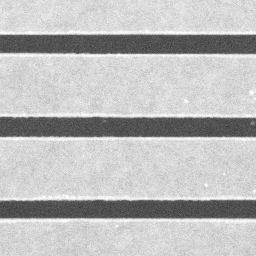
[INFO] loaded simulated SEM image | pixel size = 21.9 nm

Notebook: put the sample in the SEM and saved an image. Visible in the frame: lines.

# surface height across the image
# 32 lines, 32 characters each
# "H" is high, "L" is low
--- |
HHHHHHHHHHHHHHHHHHHHHHHHHHHHHHHH
HHHHHHHHHHHHHHHHHHHHHHHHHHHHHHHH
HHHHHHHHHHHHHHHHHHHHHHHHHHHHHHHH
HHHHHHHHHHHHHHHHHHHHHHHHHHHHHHHH
LLLLLLLLLLLLLLLLLLLLLLLLLLLLLLLL
LLLLLLLLLLLLLLLLLLLLLLLLLLLLLLLL
LLLLLLLLLLLLLLLLLLLLLLLLLLLLLLLL
HHHHHHHHHHHHHHHHHHHHHHHHHHHHHHHH
HHHHHHHHHHHHHHHHHHHHHHHHHHHHHHHH
HHHHHHHHHHHHHHHHHHHHHHHHHHHHHHHH
HHHHHHHHHHHHHHHHHHHHHHHHHHHHHHHH
HHHHHHHHHHHHHHHHHHHHHHHHHHHHHHHH
HHHHHHHHHHHHHHHHHHHHHHHHHHHHHHHH
HHHHHHHHHHHHHHHHHHHHHHHHHHHHHHHH
HHHHHHHHHHHHHHHHHHHHHHHHHHHHHHHH
LLLLLLLLLLLLLLLLLLLLLLLLLLLLLLLL
LLLLLLLLLLLLLLLLLLLLLLLLLLLLLLLL
HHHHHHHHHHHHHHHHHHHHHHHHHHHHHHHH
HHHHHHHHHHHHHHHHHHHHHHHHHHHHHHHH
HHHHHHHHHHHHHHHHHHHHHHHHHHHHHHHH
HHHHHHHHHHHHHHHHHHHHHHHHHHHHHHHH
HHHHHHHHHHHHHHHHHHHHHHHHHHHHHHHH
HHHHHHHHHHHHHHHHHHHHHHHHHHHHHHHH
HHHHHHHHHHHHHHHHHHHHHHHHHHHHHHHH
HHHHHHHHHHHHHHHHHHHHHHHHHHHHHHHH
LLLLLLLLLLLLLLLLLLLLLLLLLLLLLLLL
LLLLLLLLLLLLLLLLLLLLLLLLLLLLLLLL
HHHHHHHHHHHHHHHHHHHHHHHHHHHHHHHH
HHHHHHHHHHHHHHHHHHHHHHHHHHHHHHHH
HHHHHHHHHHHHHHHHHHHHHHHHHHHHHHHH
HHHHHHHHHHHHHHHHHHHHHHHHHHHHHHHH
HHHHHHHHHHHHHHHHHHHHHHHHHHHHHHHH